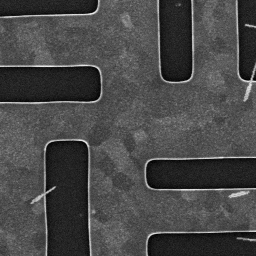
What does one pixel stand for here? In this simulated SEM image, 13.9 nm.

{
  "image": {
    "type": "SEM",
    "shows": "groups of lines, slits or small figures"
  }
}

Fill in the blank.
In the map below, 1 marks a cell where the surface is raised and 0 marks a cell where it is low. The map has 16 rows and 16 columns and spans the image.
0000001111001110
1111111111001110
1111111111001110
1111111111001110
0000001111001110
0000001111111111
1111111111111111
1111111111111111
1111111111111111
1110001111111111
1110001110000000
1110001110000000
1110001111111111
1110001111111111
1110001111111100
1110001110000000